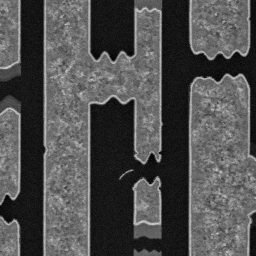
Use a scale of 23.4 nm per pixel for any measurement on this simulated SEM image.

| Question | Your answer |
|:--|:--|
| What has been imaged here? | one or a few lines or trenches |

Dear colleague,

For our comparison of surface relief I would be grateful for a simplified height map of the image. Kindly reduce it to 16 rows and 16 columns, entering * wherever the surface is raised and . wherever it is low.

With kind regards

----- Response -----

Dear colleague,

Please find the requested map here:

*..***......****
*..***..**..****
*..***..**..****
*..***..**......
...*******......
...*******..****
...***..**..****
*..***..**..****
*..***..**..****
*..***...*..****
*..***......****
*..***...*..****
...***..**..****
...***..**..****
*..***......****
*..***......***.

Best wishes